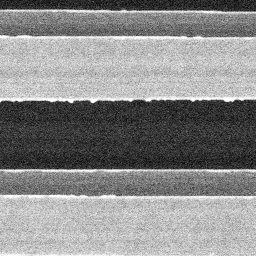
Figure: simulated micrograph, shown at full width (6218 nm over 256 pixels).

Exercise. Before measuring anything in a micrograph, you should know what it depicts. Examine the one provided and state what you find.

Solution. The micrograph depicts lines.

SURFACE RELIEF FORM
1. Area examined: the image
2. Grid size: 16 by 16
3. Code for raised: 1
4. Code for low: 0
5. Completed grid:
0000000000000000
1111111111111111
1111111111111111
1111111111111111
1111111111111111
1111111111111111
0000000000000000
0000000000000000
0000000000000000
0000000000000000
0000000000000000
1111111111111111
1111111111111111
1111111111111111
1111111111111111
1111111111111111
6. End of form